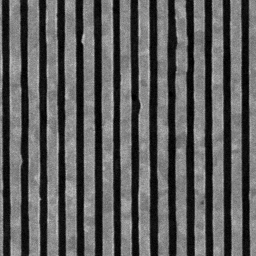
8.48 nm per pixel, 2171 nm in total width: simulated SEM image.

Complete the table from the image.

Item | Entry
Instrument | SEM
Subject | parallel lines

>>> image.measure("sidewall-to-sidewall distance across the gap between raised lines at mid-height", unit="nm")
69.9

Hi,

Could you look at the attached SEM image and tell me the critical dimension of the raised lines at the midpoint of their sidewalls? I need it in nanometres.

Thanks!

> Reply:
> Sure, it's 85.8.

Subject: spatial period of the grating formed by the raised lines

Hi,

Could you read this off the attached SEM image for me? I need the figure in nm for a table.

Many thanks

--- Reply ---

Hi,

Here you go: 156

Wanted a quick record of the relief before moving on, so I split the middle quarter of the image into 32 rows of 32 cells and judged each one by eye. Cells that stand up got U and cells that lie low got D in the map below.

UUUDDUUDDDUUDDUUUDDUUDDUUUDDUUUD
UUUDDUUDDDUUDDUUUDDUUDDUUUDDUUUD
UUUDDUUDDDUUDDUUUDDUUDDUUUDDUUDD
UUUDDUUDDDUUDDUUUDDUUDDUUUDDUUDD
UUUDDUUDDDUUDDUUUDDUUDDUUUDDUUDD
UUUDDUUDDDUUDDUUUDDUUDDUUUDDUUUD
UUUDDUUDDDUUDDUUUDDUUDDDUUDDUUUD
UUUDDUUDDDUUDDUUUDDUUDDDUUDDUUUD
UUUDDUUDDDUUDDUUUDDUUDDDUUDDUUUD
UUUDDUUUDDUUDDUUUDDUUDDDUUDDUUDD
UUUDDUUUDDUUDDUUUDDUUDDDUUDDUUUD
UUUDDUUUDDUUDDUUUDDUUDDDUUDDUUUD
UUUDDUUUDDUUDDUUUDDUUDDDUUDDUUUD
UUUDDUUUDDUUDDUUUDDUUDDUUUDDUUUD
UUUDDUUUDDUUDDUUUDDUUDDDUUDDUUUD
UUUDDUUUDDUUDDUUUDDUUDDDUUDDUUUD
UUUDDUUUDDUUDDUUUDDUUDDDUUDDUUUD
UUUDDUUUDDUUDDUUUDDUUDDDUUDDUUUD
UUUDDUUUDDUUDDUUUDDUUDDDUUDDUUUD
UUUDDUUUDDUUDDUUUDDUUDDDUUDDUUDD
UUUDDUUUDDUUDDUUUDDUUDDDUUDDUUDD
UUUDDUUUDDUUDDUUUDDUUDDDUUDDUUDD
UUUDDUUUDDUUDDUUUDDUUDDDUUDDUUDD
UUUDDUUUDDUUDDUUUDDUUDDDUUDDUUDD
DUUDDUUUDDUUDDUUUDDUUDDDUUDDUUDD
DUUDDUUUDDUUDDUUUDDUUDDDUUDDUUDD
DUUDDUUUDDUUDDUUUDDUUDDUUUDDUUDD
DUUDDUUUDDUUDDUUUDDUUDDUUUDDUUDD
DUUDDUUUDDUUDDUUUDDUUDDDUUDDUUDD
DUUDDUUUDDUUDDUUUDDUUDDDUUDDUUDD
DUUDDUUUDDUUDDUUUDDUUDDDUUDDUUDD
DUUDDUUUDDUUDDUUUDDUUDDDUUDDUUDD